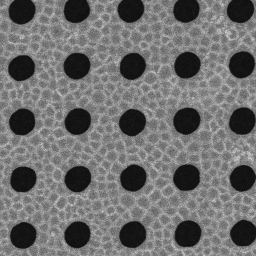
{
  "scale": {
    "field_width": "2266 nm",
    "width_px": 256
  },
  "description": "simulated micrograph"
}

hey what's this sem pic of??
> a regular array of holes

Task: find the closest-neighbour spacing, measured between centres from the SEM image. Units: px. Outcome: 54.2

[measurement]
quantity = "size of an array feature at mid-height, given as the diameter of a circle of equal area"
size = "235 nanometres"